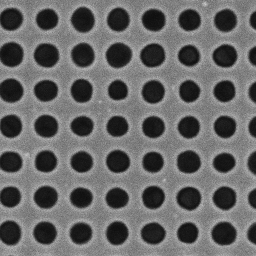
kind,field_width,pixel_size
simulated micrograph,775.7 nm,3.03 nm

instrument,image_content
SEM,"a regular array of holes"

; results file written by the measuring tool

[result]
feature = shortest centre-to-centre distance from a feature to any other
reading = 107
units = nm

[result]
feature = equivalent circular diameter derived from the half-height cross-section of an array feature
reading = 68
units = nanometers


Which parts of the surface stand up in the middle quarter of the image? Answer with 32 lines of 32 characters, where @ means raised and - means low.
@@@@--@@@@@@---@@@@@@--@@@@@@@@-
@@@@@@@@@@@@@@@@@@@@@@@@@@@@@@@@
@@@@@@@@@@@@@@@@@@@@@@@@@@@@@@@@
@@@@@@@@@@@@@@@@@@@@@@@@@@@@@@@@
@@@---@@@@@@---@@@@@@---@@@@@@--
@@-----@@@@-----@@@@-----@@@@---
@@-----@@@@-----@@@@-----@@@@---
@@-----@@@@-----@@@@-----@@@@---
@@-----@@@@@---@@@@@-----@@@@---
@@@---@@@@@@@@@@@@@@@---@@@@@@@-
@@@@@@@@@@@@@@@@@@@@@@@@@@@@@@@@
@@@@@@@@@@@@@@@@@@@@@@@@@@@@@@@@
@@@@@@@@@@@@@@@@@@@@@@@@@@@@@@@@
@@@---@@@@@@---@@@@@@---@@@@@@--
@@-----@@@@-----@@@@-----@@@@---
@@-----@@@@-----@@@@-----@@@----
@@-----@@@@-----@@@@-----@@@@---
@@@---@@@@@----@@@@@----@@@@@---
@@@@@@@@@@@@@@@@@@@@@@-@@@@@@@--
@@@@@@@@@@@@@@@@@@@@@@@@@@@@@@@@
@@@@@@@@@@@@@@@@@@@@@@@@@@@@@@@@
@@@@@@@@@@@@@@@@@@@@@@@@@@@@@@@@
@@@---@@@@@-----@@@@@---@@@@@---
@@-----@@@@-----@@@@-----@@@----
@@-----@@@@------@@@-----@@@----
@@-----@@@@-----@@@@-----@@@----
@@@---@@@@@----@@@@@@---@@@@@---
@@@@@@@@@@@@@@@@@@@@@@@@@@@@@@@@
@@@@@@@@@@@@@@@@@@@@@@@@@@@@@@@@
@@@@@@@@@@@@@@@@@@@@@@@@@@@@@@@@
@@@@@@@@@@@@@@@@@@@@@@-@@@@@@@@@
@@@---@@@@@@---@@@@@-----@@@@---